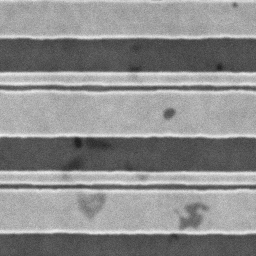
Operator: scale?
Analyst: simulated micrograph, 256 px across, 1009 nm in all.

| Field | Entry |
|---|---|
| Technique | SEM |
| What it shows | lines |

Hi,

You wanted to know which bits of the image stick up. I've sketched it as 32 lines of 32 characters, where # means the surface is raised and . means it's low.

################################
################################
################################
################################
################################
................................
................................
................................
................................
################################
################################
################################
################################
################################
################################
################################
################################
................................
................................
................................
................................
#################.....##........
################################
################################
################################
################################
################################
################################
################################
................................
................................
................................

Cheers